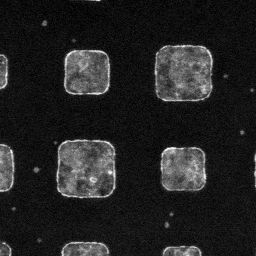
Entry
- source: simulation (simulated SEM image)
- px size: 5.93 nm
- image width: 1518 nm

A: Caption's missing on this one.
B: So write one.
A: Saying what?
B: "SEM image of raised bodies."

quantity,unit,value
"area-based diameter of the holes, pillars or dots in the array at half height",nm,323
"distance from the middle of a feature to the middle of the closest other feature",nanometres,569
